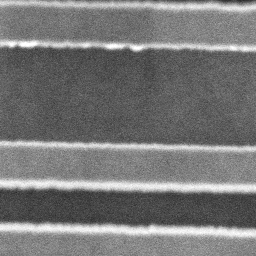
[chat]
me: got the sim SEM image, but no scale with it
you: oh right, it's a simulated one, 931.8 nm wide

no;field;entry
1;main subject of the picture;lines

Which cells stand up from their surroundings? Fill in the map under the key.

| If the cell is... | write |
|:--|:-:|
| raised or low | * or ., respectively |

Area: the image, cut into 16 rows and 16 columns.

****************
****************
****************
................
................
................
................
................
................
****************
****************
****************
................
................
****************
****************